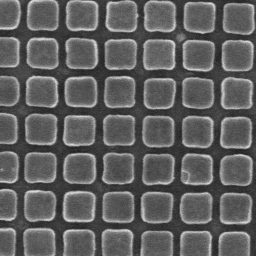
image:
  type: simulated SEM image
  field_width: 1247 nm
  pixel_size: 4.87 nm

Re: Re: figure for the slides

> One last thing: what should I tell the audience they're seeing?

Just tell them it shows a regular array of raised bodies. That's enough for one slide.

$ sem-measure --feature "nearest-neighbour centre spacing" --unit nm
184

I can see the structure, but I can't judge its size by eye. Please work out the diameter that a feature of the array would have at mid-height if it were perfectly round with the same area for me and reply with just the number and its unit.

163 nm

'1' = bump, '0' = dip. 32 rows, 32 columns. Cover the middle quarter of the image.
01111111000111111100111111100011
00000000000000000000000000000000
00000000000000000000000000000000
00101110000000111000000000000001
11111111001111111100111111110011
11111111001111111100111111110011
11111111001111111100111111110011
11111111001111111100111111110011
01111111001111111000111111100011
01111111001111111000111111100011
00000000000111111000011111100011
00000000000000000000000000000000
00000000000000000000000000000000
11111110001111111000011111100011
11111111001111111100111111100011
11111111001111111100111111100011
11111111001111111100111111100011
11111111001111111100111111100011
11111110001111111100111111100011
11111110001111111100111111100011
00000000000000000000001100000001
00000000000000000000000000000000
00111000000111110000000000000000
01111111001111111000111111100011
11111111001111111000111111100011
11111111001111111000111111100111
11111111001111111000111111100111
11111111001111111000111111100001
11111110001111111000111111100001
01111110001111111000111111100011
00000000000000000000000000000000
00000000000000000000000000000000